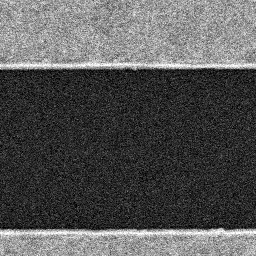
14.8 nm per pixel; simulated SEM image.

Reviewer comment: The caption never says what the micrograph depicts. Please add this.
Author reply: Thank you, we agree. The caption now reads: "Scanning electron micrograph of one or a few lines or trenches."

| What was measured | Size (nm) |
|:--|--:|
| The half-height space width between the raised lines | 2470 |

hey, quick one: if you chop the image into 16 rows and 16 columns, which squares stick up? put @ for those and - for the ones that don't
@@@@@@@@@@@@@@@@
@@@@@@@@@@@@@@@@
@@@@@@@@@@@@@@@@
@@@@@@@@@@@@@@@@
----------------
----------------
----------------
----------------
----------------
----------------
----------------
----------------
----------------
----------------
----------------
@@@@@@@@@@@@@@@@